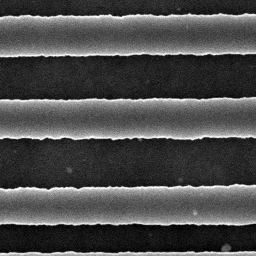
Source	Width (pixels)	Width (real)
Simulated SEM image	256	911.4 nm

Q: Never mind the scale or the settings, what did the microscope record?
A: lines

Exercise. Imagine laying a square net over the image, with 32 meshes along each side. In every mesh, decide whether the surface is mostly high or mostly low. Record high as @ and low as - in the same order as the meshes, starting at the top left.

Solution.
--------------------------------
--------------------------------
@@@@@@@@@@@@@@@@@@@@@@@@@@@@@@@@
@@@@@@@@@@@@@@@@@@@@@@@@@@@@@@@@
@@@@@@@@@@@@@@@@@@@@@@@@@@@@@@@@
@@@@@@@@@@@@@@@@@@@@@@@@@@@@@@@@
@@@@@@@@@@@@@@@@@@@@@@@@@@@@@@@@
--------------------------------
--------------------------------
--------------------------------
--------------------------------
--------------------------------
@@@@@@@@@@@@@@@@@@@@@@@@@@@@@@@@
@@@@@@@@@@@@@@@@@@@@@@@@@@@@@@@@
@@@@@@@@@@@@@@@@@@@@@@@@@@@@@@@@
@@@@@@@@@@@@@@@@@@@@@@@@@@@@@@@@
@@@@@@@@@@@@@@@@@@@@@@@@@@@@@@@@
--------------------------------
--------------------------------
--------------------------------
--------------------------------
--------------------------------
--------------------------------
--@@---@@-@@@@@@@@@@@@@@@@@@@@@@
@@@@@@@@@@@@@@@@@@@@@@@@@@@@@@@@
@@@@@@@@@@@@@@@@@@@@@@@@@@@@@@@@
@@@@@@@@@@@@@@@@@@@@@@@@@@@@@@@@
@@@@@@@@@@@@@@@@@@@@@@@@@@@@@@@@
--------------------------------
--------------------------------
--------------------------------
--------@--------------@-@---@@@